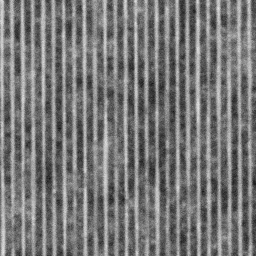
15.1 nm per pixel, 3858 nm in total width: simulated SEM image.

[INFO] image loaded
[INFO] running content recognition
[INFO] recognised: parallel lines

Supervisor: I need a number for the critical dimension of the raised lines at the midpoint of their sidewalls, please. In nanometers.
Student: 30.1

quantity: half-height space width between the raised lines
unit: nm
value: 119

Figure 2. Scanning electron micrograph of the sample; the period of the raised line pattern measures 156 nm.